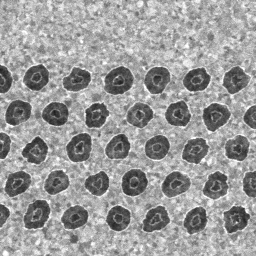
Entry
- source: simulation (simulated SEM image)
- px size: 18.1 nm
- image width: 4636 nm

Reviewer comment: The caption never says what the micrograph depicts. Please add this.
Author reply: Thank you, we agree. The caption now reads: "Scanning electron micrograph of a regular array of ring-shaped grooves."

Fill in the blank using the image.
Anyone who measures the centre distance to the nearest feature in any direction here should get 688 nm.